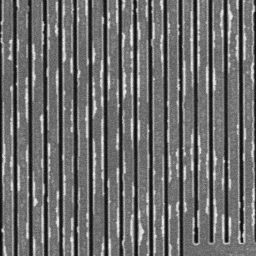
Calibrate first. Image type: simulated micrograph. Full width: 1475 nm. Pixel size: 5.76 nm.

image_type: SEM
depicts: parallel lines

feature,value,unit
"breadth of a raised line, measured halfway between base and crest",0.0605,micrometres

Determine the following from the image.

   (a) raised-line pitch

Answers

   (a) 86.8 nm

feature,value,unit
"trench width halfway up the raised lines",0.0223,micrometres